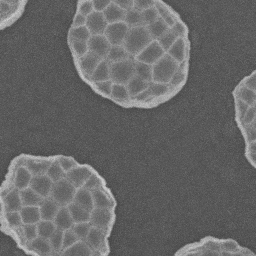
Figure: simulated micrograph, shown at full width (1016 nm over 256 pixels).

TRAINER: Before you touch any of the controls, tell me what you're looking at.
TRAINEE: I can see raised bodies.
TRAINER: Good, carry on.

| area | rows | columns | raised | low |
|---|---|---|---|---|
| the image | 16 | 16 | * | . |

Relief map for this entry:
*....*****......
....*******.....
....********....
.....*******....
.....*******....
......*****....*
........*......*
...............*
...............*
...............*
.*****..........
*******.........
*******.........
*******.........
.******.........
.******.....***.